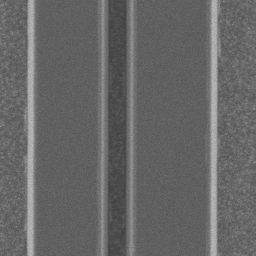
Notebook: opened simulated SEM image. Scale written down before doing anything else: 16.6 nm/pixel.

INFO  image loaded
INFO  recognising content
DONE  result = one or a few lines or trenches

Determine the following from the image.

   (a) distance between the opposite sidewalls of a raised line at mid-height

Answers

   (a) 1310 nm